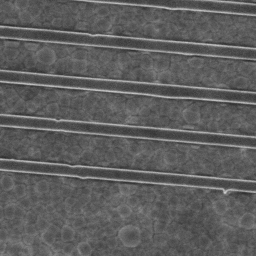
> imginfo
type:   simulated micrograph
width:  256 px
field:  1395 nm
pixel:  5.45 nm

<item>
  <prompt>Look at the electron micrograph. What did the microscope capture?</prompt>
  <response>parallel lines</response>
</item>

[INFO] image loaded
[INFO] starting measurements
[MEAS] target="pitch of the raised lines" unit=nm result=240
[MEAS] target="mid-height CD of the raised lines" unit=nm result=63.1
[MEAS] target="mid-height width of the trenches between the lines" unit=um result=0.174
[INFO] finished